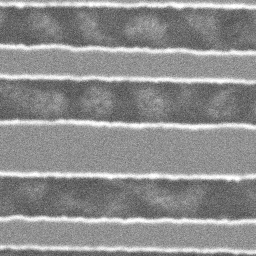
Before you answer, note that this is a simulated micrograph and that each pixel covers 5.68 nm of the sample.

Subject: lines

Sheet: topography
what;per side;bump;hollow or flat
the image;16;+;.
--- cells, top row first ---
................
................
................
++++++++++++++++
++++++++++++++++
................
................
................
++++++++++++++++
++++++++++++++++
++++++++++++++++
................
................
................
++++++++++++++++
++++++++++++++++